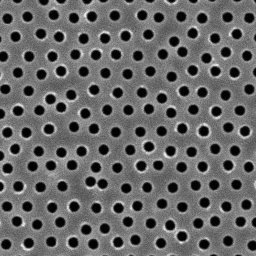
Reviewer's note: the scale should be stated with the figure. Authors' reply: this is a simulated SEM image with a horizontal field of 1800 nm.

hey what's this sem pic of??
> a regular array of holes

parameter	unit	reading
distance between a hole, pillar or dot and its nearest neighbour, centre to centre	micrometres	0.129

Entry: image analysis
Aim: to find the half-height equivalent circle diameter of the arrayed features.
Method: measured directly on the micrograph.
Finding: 72.3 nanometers